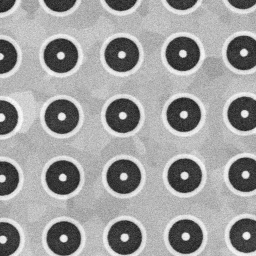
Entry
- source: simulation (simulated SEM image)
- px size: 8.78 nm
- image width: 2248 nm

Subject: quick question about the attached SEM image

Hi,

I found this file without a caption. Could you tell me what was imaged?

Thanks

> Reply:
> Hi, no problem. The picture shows an array of small figures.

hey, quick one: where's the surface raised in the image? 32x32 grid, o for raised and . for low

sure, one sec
..ooo.....ooo....oooo....oooo...
.ooooo..oooooo..oooooooooooooooo
oooooooooooooooooooooooooooooooo
oooooooooooooooooooooooooooooooo
oooooooooooooooooooooo..ooooo...
..oooo....ooo....oooo....ooo....
..ooo.....ooo.....oo.....ooo....
..ooo.....ooo.....ooo....ooo....
..oooo...ooooo...oooo...ooooo...
oooooooooooooooooooooooooooooooo
oooooooooooooooooooooooooooooooo
oooooooooooooooooooooooooooooooo
.ooooo...ooooo...ooooo...oooo...
..oooo....ooo.....ooo....ooo....
..ooo.....ooo.....ooo....ooo....
..oooo....ooo.....ooo....oooo...
..oooo...ooooo...ooooo..oooooo.o
oooooooooooooooooooooooooooooooo
oooooooooooooooooooooooooooooooo
oooooooooooooooooooooooooooooo.o
..oooo....oooo...oooo....oooo...
..oooo....ooo.....ooo....ooo....
...oo.....ooo.....ooo....ooo....
..oooo....oooo...oooo....oooo...
.oooooo..ooooooooooooooooooooooo
oooooooooooooooooooooooooooooooo
oooooooooooooooooooooooooooooooo
ooooooo..oooooo..ooooo..oooooo..
..oooo....oooo....ooo....oooo...
...ooo....ooo.....ooo.....oo....
...ooo....ooo.....ooo....oooo...
..oooo....oooo...ooooo...ooooo..